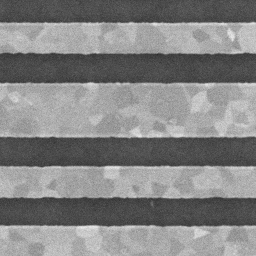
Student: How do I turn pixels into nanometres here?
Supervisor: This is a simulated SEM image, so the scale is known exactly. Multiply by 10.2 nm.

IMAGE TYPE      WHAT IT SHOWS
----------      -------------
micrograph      lines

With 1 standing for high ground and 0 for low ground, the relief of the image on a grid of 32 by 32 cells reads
00000000000000000000000000000000
00000000000000000000000000000000
00000000000000000000000000000000
11111111111111111111111111111111
11111111111111111111111111111111
11111111111111111111111111111111
11111111111111111111111111111111
00000000000000000000000000000000
00000000000000000000000000000000
00000000000000000000000000000000
11111111111111111111011111111111
11111111111111111111111111111111
11111111111111111111111111111111
11111111111111111111111111111111
11111111111111111111111111111111
11111111111111111111111111111111
11111111111111111111111111111111
00000000000000000000000000000000
00000000000000000000000000000000
00000000000000000000000000000000
00000000000000000000000000000000
11111111111111111111111111111111
11111111111111111111111111111111
11111111111111111111111111111111
11111111111111111111111111111111
00000000000000000000000000000000
00000000000000000000000000000000
00000000000000000000000000000000
11111111111111111111111111111111
11111111111111111111111111111111
11111111111111111111111111111111
11111111111111111111111111111111